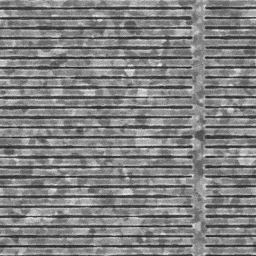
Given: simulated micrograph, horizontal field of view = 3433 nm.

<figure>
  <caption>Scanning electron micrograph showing parallel lines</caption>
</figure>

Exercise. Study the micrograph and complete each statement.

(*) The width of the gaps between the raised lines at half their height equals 48.6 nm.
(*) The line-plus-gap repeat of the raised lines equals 0.133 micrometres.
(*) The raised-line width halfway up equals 87.2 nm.